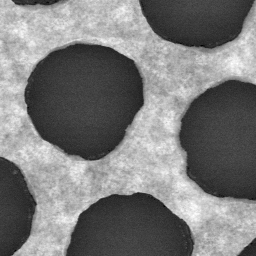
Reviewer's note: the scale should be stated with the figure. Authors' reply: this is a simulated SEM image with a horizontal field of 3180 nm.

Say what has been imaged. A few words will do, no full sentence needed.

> holes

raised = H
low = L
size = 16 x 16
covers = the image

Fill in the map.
HHHHHHHHHLLLLLLL
HHHHHHHHHLLLLLLH
HHHHHHHHHHLLLLLH
HHHLLLLLHHHHHHHH
HHLLLLLLLHHHHHHH
HHLLLLLLLHHHHLLL
HHLLLLLLLHHHLLLL
HHLLLLLLHHHLLLLL
HHLLLLLLHHHLLLLL
HHHHLLLHHHHLLLLL
LHHHHHHHHHHHLLLL
LLHHHHHHHHHHLLLL
LLHHHHLLLLHHHHLL
LLHHHLLLLLLHHHHH
LLHHLLLLLLLLHHHH
LHHHLLLLLLLLHHHL